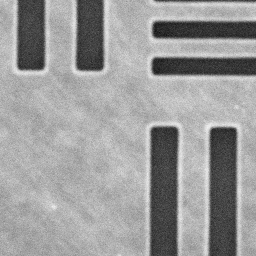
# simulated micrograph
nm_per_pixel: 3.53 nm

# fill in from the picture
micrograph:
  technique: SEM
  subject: groups of lines, slits or small figures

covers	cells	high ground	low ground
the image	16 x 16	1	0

1001100111111111
1001100111000000
1001100111000000
1001100111000000
1111101111000000
1111111111111111
1111111111111111
1111111111111111
1111111110011001
1111111110011001
1111111110011001
1111111110011001
1111111110011001
1111111110011001
1111111110011001
1111111110011001